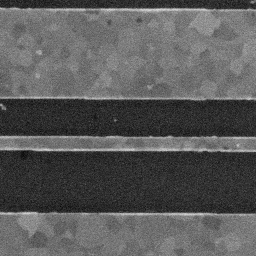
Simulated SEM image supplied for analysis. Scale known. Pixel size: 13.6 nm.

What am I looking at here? lines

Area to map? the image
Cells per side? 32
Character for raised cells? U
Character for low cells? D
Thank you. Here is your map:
DDDDDDDDDDDDDDDDDDDDDDDDDDDDDDDD
UUUUUUUUUUUUUUUUUUUUUUUUUUUUUUUU
UUUUUUUUUUUUUUUUUUUUUUUUUUUUUUUU
UUUUUUUUUUUUUUUUUUUUUUUUUUUUUUUU
UUUUUUUUUUUUUUUUUUUUUUUUUUUUUUUU
UUUUUUUUUUUUUUUUUUUUUUUUUUUUUUUU
UUUUUUUUUUUUUUUUUUUUUUUUUUUUUUUU
UUUUUUUUUUUUUUUUUUUUUUUUUUUUUUUU
UUUUUUUUUUUUUUUUUUUUUUUUUUUUUUUU
UUUUUUUUUUUUUUUUUUUUUUUUUUUUUUUU
UUUUUUUUUUUUUUUUUUUUUUUUUUUUUUUU
UUUUUUUUUUUUUUUUUUUUUUUUUUUUUUUU
DDDDDDDDDDDDDDDDDDDDDDDDDDDDDDDD
DDDDDDDDDDDDDDDDDDDDDDDDDDDDDDDD
DDDDDDDDDDDDDDDDDDDDDDDDDDDDDDDD
DDDDDDDDDDDDDDDDDDDDDDDDDDDDDDDD
DDDDDDDDDDDDDDDDDDDDDDDDDDDDDDDD
UUUUUUUUUUUUUUUUUUUUUUUUUUUUUUUU
UUUUUUUUUUUUUUUUUUUUUUUUUUUUUUUU
DDDDDDDDDDDDDDDDDDDDDDDDDDDDDDDD
DDDDDDDDDDDDDDDDDDDDDDDDDDDDDDDD
DDDDDDDDDDDDDDDDDDDDDDDDDDDDDDDD
DDDDDDDDDDDDDDDDDDDDDDDDDDDDDDDD
DDDDDDDDDDDDDDDDDDDDDDDDDDDDDDDD
DDDDDDDDDDDDDDDDDDDDDDDDDDDDDDDD
DDDDDDDDDDDDDDDDDDDDDDDDDDDDDDDD
DDDDDDDDDDDDDDDDDDDDDDDDDDDDDDDD
UUUUUUUUUUUUUUUUUUUUUUUUUUUUUUUU
UUUUUUUUUUUUUUUUUUUUUUUUUUUUUUUU
UUUUUUUUUUUUUUUUUUUUUUUUUUUUUUUU
UUUUUUUUUUUUUUUUUUUUUUUUUUUUUUUU
UUUUUUUUUUUUUUUUUUUUUUUUUUUUUUUU